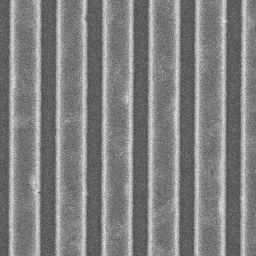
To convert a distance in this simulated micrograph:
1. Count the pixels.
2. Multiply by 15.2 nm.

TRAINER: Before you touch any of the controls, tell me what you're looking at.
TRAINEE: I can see parallel lines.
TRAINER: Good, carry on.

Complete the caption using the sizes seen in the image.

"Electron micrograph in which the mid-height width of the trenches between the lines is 289 nanometres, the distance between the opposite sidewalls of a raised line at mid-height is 0.426 µm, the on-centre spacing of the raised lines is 705 nm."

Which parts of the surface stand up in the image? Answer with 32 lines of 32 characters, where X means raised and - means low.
--XXX--XXXX--XXX---XXX---XXX--XX
--XXX--XXXX--XXX---XXX---XXX--XX
--XXX--XXXX--XXX---XXX---XXX--XX
--XXX--XXXX--XXX---XXX---XXX---X
--XXX--XXXX--XXX---XXX---XXX--XX
-XXXX--XXXX--XXX---XXX---XXX--XX
--XXX--XXXX--XXX---XXX---XXX--XX
-XXXX--XXXX--XXX---XXX---XXX--XX
--XXX--XXXX--XXX---XXX---XXX--XX
--XXX--XXXX--XXX---XXX---XXX--XX
--XXX--XXXX--XXX---XXX---XXX--XX
-XXXX--XXXX--XXX---XXX---XXX--XX
-XXXX--XXXX--XXX---XXX---XXX--XX
-XXXX--XXXX--XXX---XXX---XXX--XX
-XXXX--XXXX--XXX---XXX---XXX--XX
-XXXX--XXXX--XXX---XXX---XXX--XX
-XXXX--XXXX--XXX---XXX---XXX--XX
-XXXX--XXXX--XXX---XXX---XXX--XX
-XXXX--XXXX--XXX---XXX---XXX--XX
-XXXX--XXXX--XXX---XXX---XXX--XX
-XXXX--XXXX--XXX---XXX---XXX--XX
-XXXX--XXXX--XXX---XXX---XXX--XX
-XXXX--XXXX--XXX---XXX---XXX--XX
-XXXX--XXXX--XXX---XXX---XXX--XX
-XXXX--XXXX--XXX---XXX---XXX--XX
-XXXX--XXXX--XXX---XXX---XXX--XX
-XXXX--XXXX--XXX---XXX---XXX--XX
-XXXX--XXXX--XXX---XXX---XXX--XX
-XXXX--XXXX--XXX---XXX---XXX--XX
-XXXX--XXXX--XXX---XXX---XXX--XX
-XXXX--XXXX--XXX---XXX---XXX--XX
-XXXX--XXX---XXX---XXX---XXX--XX